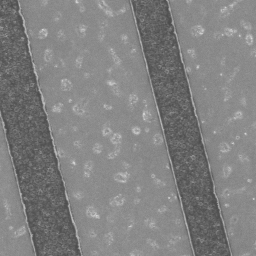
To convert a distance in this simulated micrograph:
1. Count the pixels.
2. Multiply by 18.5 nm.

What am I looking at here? one or a few lines or trenches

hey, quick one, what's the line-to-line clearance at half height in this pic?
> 2010 nm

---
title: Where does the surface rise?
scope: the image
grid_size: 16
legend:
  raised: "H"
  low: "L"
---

HLLLLLLLHHHLLLLL
HHLLLLLLLHHLLLLL
HHLLLLLLLHHLLLLL
HHLLLLLLLHHLLLLL
HHLLLLLLLHHHLLLL
HHLLLLLLLLHHLLLL
HHHLLLLLLLHHLLLL
HHHLLLLLLLHHLLLL
HHHLLLLLLLHHHLLL
LHHLLLLLLLLHHLLL
LHHHLLLLLLLHHLLL
LHHHLLLLLLLHHLLL
LHHHLLLLLLLHHHLL
LLHHHLLLLLLLHHLL
LLHHHLLLLLLLHHLL
LLHHHLLLLLLLHHLL